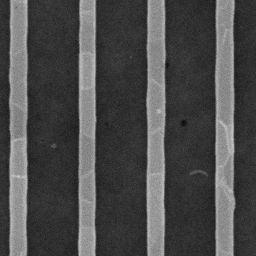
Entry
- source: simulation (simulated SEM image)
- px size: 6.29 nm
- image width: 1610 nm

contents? wiring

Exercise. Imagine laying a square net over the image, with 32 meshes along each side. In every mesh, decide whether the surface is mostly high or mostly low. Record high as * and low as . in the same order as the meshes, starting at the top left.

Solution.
.**.......**.......**......**...
.**.......**.......**......**...
.**.......**.......**......**...
.**.......**.......**......**...
.**.......**.......**......**...
.**.......**......***......**...
.**.......**......***......**...
.**.......**.......**......**...
.**.......**.......**......**...
.**.......**.......**......**...
.**.......**.......**......**...
.**.......**......***......**...
.**.......**......***......**...
.**.......**......***......**...
.**.......**......***......**...
.**.......**.......**......**...
.**.......**.......**......**...
.**.......**.......*.......**...
.**.......**.......*.......**...
.**.......**.......**......**...
.**.......**.......**......**...
.**.......**......***......**...
.**.......**......***......**...
.**.......**......**.......**...
.**.......**......**.......**...
.**.......**......**.......**...
.**.......**......***......**...
.**.......**.......**......**...
.**.......**.......**......**...
.**.......**.......**......**...
.**.......**.......*.......**...
.**.......**.......*.......**...